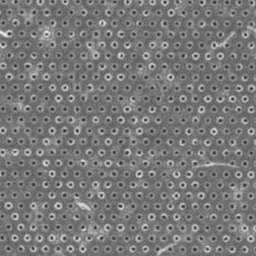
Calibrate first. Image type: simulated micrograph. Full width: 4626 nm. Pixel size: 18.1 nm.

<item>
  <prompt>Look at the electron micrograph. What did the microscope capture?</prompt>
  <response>a regular array of holes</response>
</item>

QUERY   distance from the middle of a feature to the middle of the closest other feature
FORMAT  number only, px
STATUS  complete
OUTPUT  11.9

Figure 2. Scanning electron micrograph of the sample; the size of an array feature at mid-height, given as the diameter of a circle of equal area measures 4.07 pixels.